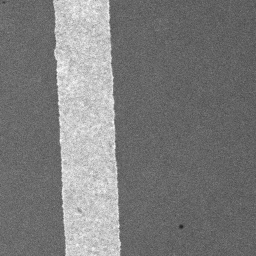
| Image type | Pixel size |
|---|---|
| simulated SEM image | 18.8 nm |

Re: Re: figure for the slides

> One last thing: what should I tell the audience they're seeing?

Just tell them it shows one or a few lines or trenches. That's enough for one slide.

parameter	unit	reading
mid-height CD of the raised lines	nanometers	1010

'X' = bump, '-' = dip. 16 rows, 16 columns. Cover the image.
---XXXX---------
---XXXX---------
----XXX---------
----XXX---------
----XXX---------
----XXX---------
----XXX---------
----XXX---------
----XXX---------
----XXX---------
----XXX---------
----XXX---------
----XXX---------
----XXX---------
----XXX---------
----XXX---------